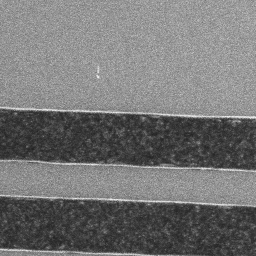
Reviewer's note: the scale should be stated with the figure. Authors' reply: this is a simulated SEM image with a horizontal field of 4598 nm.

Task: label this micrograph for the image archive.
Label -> one or a few lines or trenches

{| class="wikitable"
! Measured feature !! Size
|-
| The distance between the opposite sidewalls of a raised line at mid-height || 972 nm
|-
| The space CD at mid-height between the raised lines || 34.5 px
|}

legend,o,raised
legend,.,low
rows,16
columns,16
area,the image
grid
................
................
................
................
................
................
................
oooooooooooooooo
oooooooooooooooo
oooooooooooooooo
...........ooooo
................
oooooooo........
oooooooooooooooo
oooooooooooooooo
oooooooooooooooo